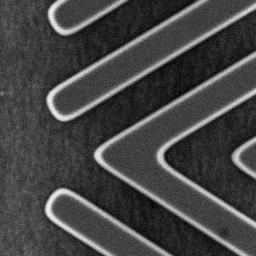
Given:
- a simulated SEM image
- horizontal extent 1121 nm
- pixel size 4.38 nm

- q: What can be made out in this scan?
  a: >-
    groups of lines, slits or small figures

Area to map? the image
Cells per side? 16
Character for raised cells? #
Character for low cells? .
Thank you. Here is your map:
...####.....####
...##.....####..
.........####...
.......####.....
.....####.....##
....####....####
...###.....####.
.........####...
.......####.....
......####.....#
.......####....#
........####....
...##.....####..
...####....####.
....####.....###
......####....##